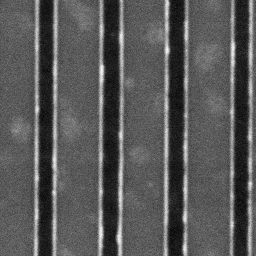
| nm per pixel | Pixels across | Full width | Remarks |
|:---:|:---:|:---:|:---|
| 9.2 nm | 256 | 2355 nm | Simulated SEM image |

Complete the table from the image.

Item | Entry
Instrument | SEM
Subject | one or a few lines or trenches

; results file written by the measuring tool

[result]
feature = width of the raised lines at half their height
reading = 0.185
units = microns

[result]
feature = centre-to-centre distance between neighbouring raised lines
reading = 600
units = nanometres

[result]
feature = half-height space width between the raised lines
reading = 413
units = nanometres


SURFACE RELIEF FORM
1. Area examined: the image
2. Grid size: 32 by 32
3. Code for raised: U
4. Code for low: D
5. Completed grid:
DDDDDUUDDDDDDUUDDDDDDUUDDDDDDUUD
DDDDDUUDDDDDDUUDDDDDDUUDDDDDDUUD
DDDDDUUDDDDDDUUDDDDDDUUDDDDDDUUD
DDDDDUUDDDDDDUUDDDDDDUUDDDDDDUUD
DDDDDUUDDDDDDUUDDDDDDUUDDDDDDUUD
DDDDDUUDDDDDDUUDDDDDDUUDDDDDDUUD
DDDDDUUDDDDDDUUDDDDDDUUDDDDDDUUD
DDDDDUUDDDDDDUUDDDDDDUUDDDDDDUUD
DDDDDUUDDDDDDUUDDDDDDUUDDDDDDUUD
DDDDDUUDDDDDDUUDDDDDDUUDDDDDDUUD
DDDDDUUDDDDDDUUDDDDDDUUDDDDDDUUD
DDDDDUUDDDDDDUUDDDDDDUUDDDDDDUUD
DDDDDUUDDDDDDUUDDDDDDUUDDDDDDUUD
DDDDDUUDDDDDDUUDDDDDDUUDDDDDDUUD
DDDDDUUDDDDDDUUDDDDDDUUDDDDDDUUD
DDDDDUUDDDDDDUUDDDDDDUUDDDDDDUUD
DDDDDUUDDDDDDUUDDDDDDUUDDDDDDUUD
DDDDUUUDDDDDDUUDDDDDDUUDDDDDDUUD
DDDDDUUDDDDDDUUDDDDDDUUDDDDDDUUD
DDDDDUUDDDDDDUUDDDDDDUUDDDDDDUUD
DDDDDUUDDDDDDUUDDDDDDUUDDDDDDUUD
DDDDDUUDDDDDDUUDDDDDDUUDDDDDDUUD
DDDDDUUDDDDDDUUDDDDDDUUDDDDDDUUD
DDDDDUUDDDDDDUUDDDDDDUUDDDDDDUUD
DDDDDUUDDDDDDUUDDDDDDUUDDDDDDUUD
DDDDDUUDDDDDDUUDDDDDDUUDDDDDDUUD
DDDDDUUDDDDDDUUDDDDDDUUDDDDDDUUD
DDDDDUUDDDDDUUUDDDDDDUUDDDDDDUUD
DDDDDUUDDDDDUUUDDDDDDUUDDDDDDUUD
DDDDDUUDDDDDUUUDDDDDDUUDDDDDDUUD
DDDDDUUDDDDDUUUDDDDDDUUDDDDDDUUD
DDDDDUUDDDDDUUUDDDDDDUUDDDDDDUUD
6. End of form